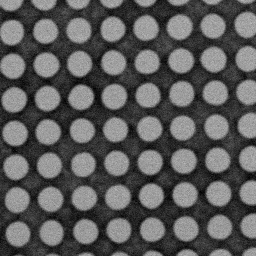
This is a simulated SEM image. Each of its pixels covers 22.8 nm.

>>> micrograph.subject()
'an array of small figures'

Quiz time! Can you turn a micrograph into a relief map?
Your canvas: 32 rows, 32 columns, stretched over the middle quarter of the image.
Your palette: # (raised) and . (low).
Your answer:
.######...#####...######..######
.#####....#####...#####....####.
..####.....###..................
................................
.............................#..
...##......###.....####....#####
..#####...#####...######...#####
.######...######..######...#####
.######...######..######...#####
.######...#####...######...#####
..#####...#####.....##.......#..
................................
................................
............##......###.....###.
..#####....####....#####...#####
..#####...######..######...#####
..#####...######..######...#####
..#####...######...#####...#####
..#####....####....####.....###.
...###..........................
................................
.............................##.
....##.....####....#####....####
..#####...######...#####...#####
..######..######...######..#####
..######..######...#####...#####
..#####....#####...#####....####
...####.....###......##.........
................................
................................
............###.....###.....####
...####....#####...######..#####